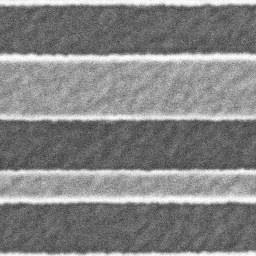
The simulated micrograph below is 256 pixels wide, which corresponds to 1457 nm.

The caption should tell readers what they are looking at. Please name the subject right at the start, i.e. lines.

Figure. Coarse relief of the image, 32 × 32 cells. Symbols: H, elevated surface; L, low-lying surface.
LLLLLLLLLLLLLLLLLLLLLLLLLLLLLLLL
LLLLLLLLLLLLLLLLLLLLLLLLLLLLLLLL
LLLLLLLLLLLLLLLLLLLLLLLLLLLLLLLL
LLLLLLLLLLLLLLLLLLLLLLLLLLLLLLLL
LLLLLLLLLLLLLLLLLLLLLLLLLLLLLLLL
LLLLLLLLLLLLLLLLLLLLLLLLLLLLLLLL
LLLLLLLLLLLLLLLLLLLLLLLLLLLLLLLL
HHHHHHHHHHHHHHHHHHHHHHHHHHHHHHHH
HHHHHHHHHHHHHHHHHHHHHHHHHHHHHHHH
HHHHHHHHHHHHHHHHHHHHHHHHHHHHHHHH
HHHHHHHHHHHHHHHHHHHHHHHHHHHHHHHH
HHHHHHHHHHHHHHHHHHHHHHHHHHHHHHHH
HHHHHHHHHHHHHHHHHHHHHHHHHHHHHHHH
HHHHHHHHHHHHHHHHHHHHHHHHHHHHHHHH
HHHHHHHHHHHHHHHHHHHHHHHHHHHHHHHH
LLLLLLLLLLLLLLLLLLLLLLLLLLLLLLLL
LLLLLLLLLLLLLLLLLLLLLLLLLLLLLLLL
LLLLLLLLLLLLLLLLLLLLLLLLLLLLLLLL
LLLLLLLLLLLLLLLLLLLLLLLLLLLLLLLL
LLLLLLLLLLLLLLLLLLLLLLLLLLLLLLLL
LLLLLLLLLLLLLLLLLLLLLLLLLLLLLLLL
HHHHHHHHHHHHHHHHHHHHHHHHHHHHHHHH
HHHHHHHHHHHHHHHHHHHHHHHHHHHHHHHH
HHHHHHHHHHHHHHHHHHHHHHHHHHHHHHHH
HHHHHHHHHHHHHHHHHHHHHHHHHHHHHHHH
LLLLLLLLLLLLLLLLLLLLLLLLLLLLLLLL
LLLLLLLLLLLLLLLLLLLLLLLLLLLLLLLL
LLLLLLLLLLLLLLLLLLLLLLLLLLLLLLLL
LLLLLLLLLLLLLLLLLLLLLLLLLLLLLLLL
LLLLLLLLLLLLLLLLLLLLLLLLLLLLLLLL
LLLLLLLLLLLLLLLLLLLLLLLLLLLLLLLL
LLLLLLLLLLLLLLLLLLLLLLLLLLLLLLLL